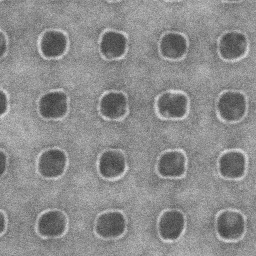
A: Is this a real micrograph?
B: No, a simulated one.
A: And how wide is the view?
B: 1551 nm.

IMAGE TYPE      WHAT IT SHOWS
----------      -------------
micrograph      a regular array of raised bodies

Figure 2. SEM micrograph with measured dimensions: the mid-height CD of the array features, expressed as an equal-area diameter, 192 nm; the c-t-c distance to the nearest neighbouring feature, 355 nanometers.